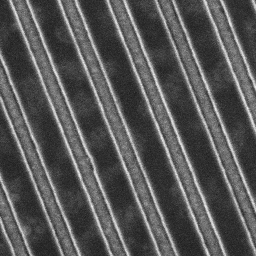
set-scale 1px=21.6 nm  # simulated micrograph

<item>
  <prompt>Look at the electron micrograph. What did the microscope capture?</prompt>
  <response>parallel lines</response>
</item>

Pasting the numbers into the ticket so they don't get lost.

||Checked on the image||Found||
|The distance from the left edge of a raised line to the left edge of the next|974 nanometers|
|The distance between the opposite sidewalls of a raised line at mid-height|652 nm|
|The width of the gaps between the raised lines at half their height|0.326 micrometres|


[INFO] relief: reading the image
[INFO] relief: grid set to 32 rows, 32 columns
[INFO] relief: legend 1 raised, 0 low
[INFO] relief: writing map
11001111001111001111001111001111
11001111001111001111001111001111
11001111001111001111000111100111
11100111100111100111100111100111
11100111100111100111100111100111
11110111110011110011110011110011
11110011110011110011110011110011
11110011110011110011110001111001
01111001111001111001111001111001
01111001111001111001111001111001
01111001111100111100111100111100
00111100111100111100111100111100
00111100111100111100111100011110
10011110011110011110011110011110
10011110011110011110011110011110
10011110001111011111001111001111
11001111001111001111001111001111
11001111001111001111001111001111
11100111100111100111100111100111
11100111100111100111100111100111
11100111100011110111110011110011
11110011110011110011110011110011
11110011110011110011110011110011
01111001111001111001111001111001
01111001111001111001111001111001
01111001111001111001111100111100
00111100111100111100111100111100
00111100111100111100111100111100
00111110011110011110011110011110
10011110011110011110011110011110
10011110011110011111001110001111
11001111001111001111001111001111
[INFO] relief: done